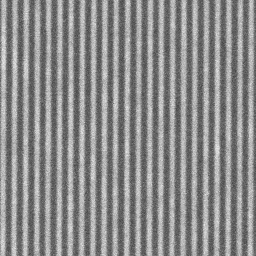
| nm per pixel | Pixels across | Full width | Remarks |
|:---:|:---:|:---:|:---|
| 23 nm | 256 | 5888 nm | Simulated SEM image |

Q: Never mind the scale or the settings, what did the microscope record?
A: parallel lines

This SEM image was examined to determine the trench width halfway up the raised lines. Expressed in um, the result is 0.196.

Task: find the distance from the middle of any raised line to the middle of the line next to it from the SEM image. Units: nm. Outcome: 259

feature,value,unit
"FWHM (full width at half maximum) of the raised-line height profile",2.87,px